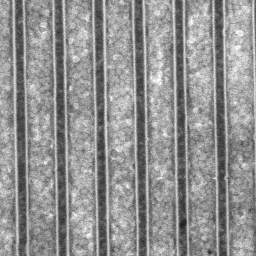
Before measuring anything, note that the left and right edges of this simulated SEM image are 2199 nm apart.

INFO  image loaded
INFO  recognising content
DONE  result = parallel lines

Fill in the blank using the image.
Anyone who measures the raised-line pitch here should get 343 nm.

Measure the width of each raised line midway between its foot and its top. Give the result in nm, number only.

95.5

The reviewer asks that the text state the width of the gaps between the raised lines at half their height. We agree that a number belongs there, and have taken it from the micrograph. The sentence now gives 246 nm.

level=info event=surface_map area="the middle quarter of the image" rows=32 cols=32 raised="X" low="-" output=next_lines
--------XX--------XX--------XX--
--------XX--------XX--------XX--
--------XX--------XX--------XX--
--------XX--------XX--------XX--
--------XX--------XX--------XX--
--------XX--------XX--------XX--
--------XX--------XX--------XX--
--------XX--------XX--------XX--
--------XXX-------XX--------XX--
--------XXX-------XX--------XX--
--------XX--------XX--------XX--
--------XX--------XX--------XX--
--------XX--------XX--------XXX-
--------XX--------XX--------XXX-
--------XX--------XXX-------XXX-
--------XX--------XXX-------XX--
X-------XX--------XXX-------XX--
X-------XX--------XXX-------XX--
X-------XX--------XXX-------XX--
X-------XX--------XXX-------XX--
X-------XX--------XXX-------XXX-
X-------XXX-------XXX-------XXX-
X-------XXX-------XXX-------XXX-
X-------XXX-------XXX-------XXX-
X-------XXX-------XXX-------XXX-
X-------XXX-------XXX-------XXX-
X-------XXX-------XXX-------XXX-
X-------XXX-------XXX-------XXX-
X-------XXX-------XXX-------XXX-
X-------XXX-------XXX-------XXX-
X-------XXX-------XXX-------XXX-
X-------XXX-------XXX-------XXX-